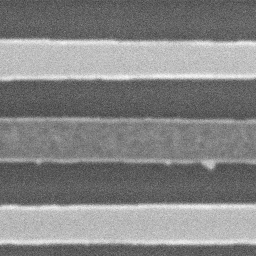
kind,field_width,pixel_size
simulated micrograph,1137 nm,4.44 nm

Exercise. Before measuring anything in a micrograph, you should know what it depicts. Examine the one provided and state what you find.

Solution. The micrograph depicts lines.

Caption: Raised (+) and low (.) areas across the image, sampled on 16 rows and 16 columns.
................
................
................
++++++++++++++++
++++++++++++++++
................
................
+++++++++++.....
++++++++++++++++
++++++++++++++++
................
................
................
++++++++++++++++
++++++++++++++++
................